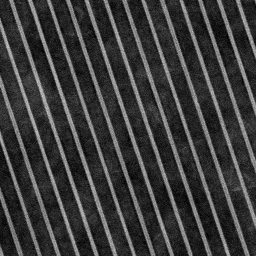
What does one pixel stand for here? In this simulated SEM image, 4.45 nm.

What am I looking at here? parallel lines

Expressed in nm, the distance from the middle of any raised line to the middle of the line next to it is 79.8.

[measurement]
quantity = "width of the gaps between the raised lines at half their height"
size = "64.9 nm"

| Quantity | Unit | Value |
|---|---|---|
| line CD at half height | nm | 13.2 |